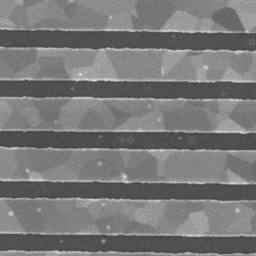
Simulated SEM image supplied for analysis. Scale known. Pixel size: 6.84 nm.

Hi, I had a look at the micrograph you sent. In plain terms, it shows lines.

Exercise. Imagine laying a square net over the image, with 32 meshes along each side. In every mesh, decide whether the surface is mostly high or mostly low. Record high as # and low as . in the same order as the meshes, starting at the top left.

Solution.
################################
################################
################################
################################
................................
................................
################################
################################
################################
################################
................................
................................
##############################..
################################
################################
################################
.....................###########
................................
#...............................
################################
################################
################################
################################
................................
................................
################################
################################
################################
################################
................................
................................
###########.###.................